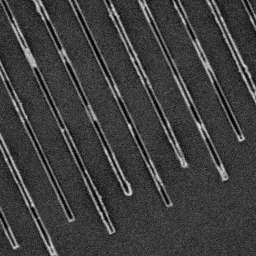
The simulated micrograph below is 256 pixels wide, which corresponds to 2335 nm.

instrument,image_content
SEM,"parallel lines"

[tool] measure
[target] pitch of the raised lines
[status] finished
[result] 0.286 µm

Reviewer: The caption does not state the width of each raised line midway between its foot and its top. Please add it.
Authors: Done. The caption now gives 53.6 nm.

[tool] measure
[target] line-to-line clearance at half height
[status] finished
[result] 233 nanometers